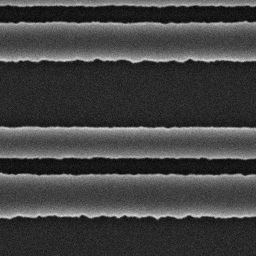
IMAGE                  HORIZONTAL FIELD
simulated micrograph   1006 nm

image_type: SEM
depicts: lines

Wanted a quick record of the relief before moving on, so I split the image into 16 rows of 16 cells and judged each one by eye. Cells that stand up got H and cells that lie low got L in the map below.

HHHHHHHHHHHHHHHH
HHHHHHHHHHHHHHHH
HHHHHHHHHHHHHHHH
HHHHHHHHHHHHHHHH
LLLLLLLLLLLLLLLL
LLLLLLLLLLLLLLLL
LLLLLLLLLLLLLLLL
LLLLLLLLLLLLLLLL
HHHHHHHHHHHHHHHH
HHHHHHHHHHHHHHHH
HHHHHHHHHHHHHHHH
HHHHHHHHHHHHHHHH
HHHHHHHHHHHHHHHH
HLLLHLLLHHHHHHHH
LLLLLLLLLLLLLLLL
LLLLLLLLLLLLLLLL